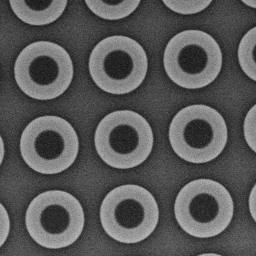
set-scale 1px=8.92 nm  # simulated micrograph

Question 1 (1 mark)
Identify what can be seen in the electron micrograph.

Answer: an array of small figures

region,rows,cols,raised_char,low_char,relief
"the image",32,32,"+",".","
.+++++++...++++++....+++++.....+
..++++++....+++++.....+++.......
...++++.........................
................................
..............+.......++++.....+
....+++.....+++++....++++++...++
...+++++....++++++...+++++++..++
..+++++++..+++++++..++++++++..++
..+++++++..+++++++...+++++++..++
..+++++++..+++++++...++++++....+
..+++++++...+++++.....++++......
...+++++.....+++................
................................
.......................+++.....+
.............+++++....++++++...+
....+++++...+++++++..+++++++...+
...++++++...+++++++..+++++++...+
...+++++++..+++++++..+++++++...+
...+++++++..+++++++...++++++...+
...+++++++...+++++....+++++.....
...++++++....++++...............
.....++.........................
.........................+......
...............+++.....+++++....
.....++++....++++++...+++++++..+
....++++++...+++++++..+++++++..+
+..+++++++...+++++++..+++++++..+
+..+++++++...+++++++..+++++++...
+..+++++++...++++++....+++++....
+...++++++....++++......+++.....
.....++++.......................
................................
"